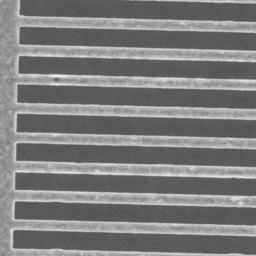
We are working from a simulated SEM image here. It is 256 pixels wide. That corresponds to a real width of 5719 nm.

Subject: parallel lines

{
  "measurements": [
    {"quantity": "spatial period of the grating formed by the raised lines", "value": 0.649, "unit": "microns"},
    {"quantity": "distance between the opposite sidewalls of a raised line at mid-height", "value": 232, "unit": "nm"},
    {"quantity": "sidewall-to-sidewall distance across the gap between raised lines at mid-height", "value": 0.421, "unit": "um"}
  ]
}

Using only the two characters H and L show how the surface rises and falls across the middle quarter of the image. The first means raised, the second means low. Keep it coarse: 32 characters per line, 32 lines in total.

LLLLLLLLLLLLLLLLLLLLLLLLLLLLLLLL
LLLLLLLLLLLLLLLLLLLLLLLLLLLLLLLL
LLLLLLLLLLLLLLLLLLLLLLLLLLLLLLLL
HHHHHHHHHHHHHHHHHHHHHHHHLLLLLLLL
LLHHLHHHHHHHHHHHHHHHHHHHHHHHHHHH
LLLLLLLLLLLHHHHHHHHHHHHHHHHHHHHH
LLLLLLLLLLLLLLLLLLLLLLLLLLLLLLLL
LLLLLLLLLLLLLLLLLLLLLLLLLLLLLLLL
LLLLLLLLLLLLLLLLLLLLLLLLLLLLLLLL
LLLLLLLLLLLLLLLLLLLLLLLLLLLLLLLL
HHHHHHHHHHHHLLLLLLLLLLLLLLLLLLLL
HHHHHHHHHHHHHHHHHHHHHHHHHHHHHHHH
HHHHHHHHHHHHHHHHHHHHHHHHHHHHHHHH
LLLLLLLLLLLLLLLLLLLLLLLLLLLLLLLL
LLLLLLLLLLLLLLLLLLLLLLLLLLLLLLLL
LLLLLLLLLLLLLLLLLLLLLLLLLLLLLLLL
LLLLLLLLLLLLLLLLLLLLLLLLLLLLLLLL
LLLLLLLLLLLLLLLLLLLLLLLLLLLLLLLL
HHHHHHHHHHHHHHHHHHHHHHHHHHHHHHHH
HHHHHHHHHHHHHHHHHHHHHHHHHHLHHHHH
LLLLLLLLLLLLLLLLLLLLLLLLHHHHHHHH
LLLLLLLLLLLLLLLLLLLLLLLLLLLLLLLL
LLLLLLLLLLLLLLLLLLLLLLLLLLLLLLLL
LLLLLLLLLLLLLLLLLLLLLLLLLLLLLLLL
LLLLLLLLLLLLLLLLLLLLLLLLLLLLLLLL
HHHHHHHHHHHHHHHHHHHHHHHHHHHHHHHH
HHHHHHHHHHLLHHHHHHHHHHHHHHHHHHHH
LLLLLLLLLLLHHHHHHHHHHHHHHHHHHHHH
LLLLLLLLLLLLLLLLLLLLLLLLLLLLLLLL
LLLLLLLLLLLLLLLLLLLLLLLLLLLLLLLL
LLLLLLLLLLLLLLLLLLLLLLLLLLLLLLLL
LLLLLLLLLLLLLLLLLLLLLLLLLLLLLLLL